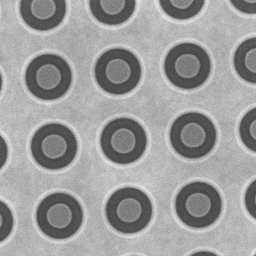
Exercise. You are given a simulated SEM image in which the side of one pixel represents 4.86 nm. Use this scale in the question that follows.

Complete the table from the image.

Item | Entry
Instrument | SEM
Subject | an array of small figures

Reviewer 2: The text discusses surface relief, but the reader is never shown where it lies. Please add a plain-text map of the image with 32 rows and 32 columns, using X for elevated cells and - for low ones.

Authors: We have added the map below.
XX------XXX------XXX------XXX---
XX------XXX------XXX-----XXXXX--
XXX-----XXXX----XXXXXX--XXXXXXXX
XXXX---XXXXXXXXXXXXXXXXXXXXXXXXX
XXXXXXXXXXXXXXXXXXXXXXXXXXXXXXXX
XXXXXXXXXXXXXXXXXXXXXX---XXXXX--
XXXXXXXXXXXXX----XXXX-----XXX---
XXXX----XXXX-----XXX------XXX---
XXX------XXX------XX------XXX---
XXX------XXX------XXX-----XXXX--
XXX------XXX-----XXXX-----XXXXX-
XXXX----XXXXX---XXXXXXXXXXXXXXXX
XXXXX--XXXXXXXXXXXXXXXXXXXXXXXXX
XXXXXXXXXXXXXXXXXXXXXXXXXXXXXXX-
XXXXXXXXXXXXXXXXXXXXXX----XXXX--
XXXXX---XXXXX-----XXX------XXX--
XXXX-----XXXX-----XXX------XXX--
-XXX------XX-------XX------XXX--
-XXX------XX------XXX------XXXX-
-XXX------XXX-----XXXX----XXXXXX
-XXXX----XXXXX--XXXXXXXXXXXXXXXX
XXXXXXXXXXXXXXXXXXXXXXXXXXXXXXXX
XXXXXXXXXXXXXXXXXXXXXXXXXXXXXXXX
XXXXXXXXXXXXXXX--XXXXXX----XXXX-
XXXXXX---XXXXX-----XXX------XX--
-XXXX-----XXX------XXX------XX--
--XX------XXX------XXX------XXX-
--XX------XXX------XXX-----XXXXX
--XXX-----XXXX----XXXXXX--XXXXXX
-XXXXX---XXXXXXXXXXXXXXXXXXXXXXX
XXXXXXXXXXXXXXXXXXXXXXXXXXXXXXXX
XXXXXXXXXXXXXXXXXXXXXXXX---XXXXX